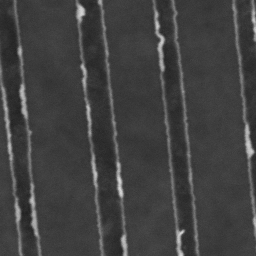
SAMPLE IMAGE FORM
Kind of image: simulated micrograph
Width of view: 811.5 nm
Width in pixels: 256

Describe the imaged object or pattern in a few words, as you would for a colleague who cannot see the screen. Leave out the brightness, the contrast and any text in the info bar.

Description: one or a few lines or trenches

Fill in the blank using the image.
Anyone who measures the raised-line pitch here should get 247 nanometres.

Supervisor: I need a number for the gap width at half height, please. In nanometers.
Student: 182